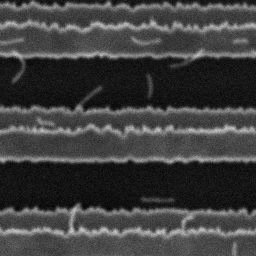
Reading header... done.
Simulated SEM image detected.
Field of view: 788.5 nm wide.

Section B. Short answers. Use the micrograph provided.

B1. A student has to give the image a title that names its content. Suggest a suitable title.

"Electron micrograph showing lines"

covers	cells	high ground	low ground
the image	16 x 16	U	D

UUUUUUUUUUUUUUUU
UUUUUUUUUUUUUUUU
UUUUUUUUUUUUUUUU
UUUUUUUUUUUUUUUU
DDDDDDDDDDDDDDDD
DDDDDDDDDDDDDDDD
DDDDDDDDDDDDDDDD
UUUUUUUUUUUUUUUU
UUUUUUUUUUUUUUUU
UUUUUUUUUUUUUUUU
DDDDDDDDDDDDDDDD
DDDDDDDDDDDDDDDD
DDDDDDDDDDDDDDDD
UUUUUUUUUUUUUUUU
UUUUUUUUUUUUUUUU
UUUUUUUUUUUUUUUU